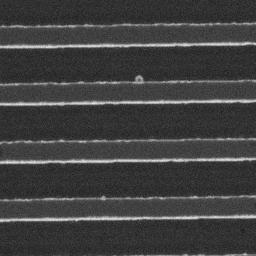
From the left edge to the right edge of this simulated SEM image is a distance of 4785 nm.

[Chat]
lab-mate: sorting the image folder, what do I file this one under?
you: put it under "lines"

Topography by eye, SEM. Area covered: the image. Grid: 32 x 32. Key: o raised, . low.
................................
................................
................................
oooooooooooooooooooooooooooooooo
oooooooooooooooooooooooooooooooo
ooooooooooooooooooooooooooooooo.
................................
................................
................................
................................
....oooooooooooooooooooooooooooo
oooooooooooooooooooooooooooooooo
oooooooooooooooooooooooooooooooo
................................
................................
................................
................................
...................o..oooooooooo
oooooooooooooooooooooooooooooooo
oooooooooooooooooooooooooooooooo
................................
................................
................................
................................
................................
oooooooooooooooooooooooooooooooo
oooooooooooooooooooooooooooooooo
oooooooo........................
................................
................................
................................
................................